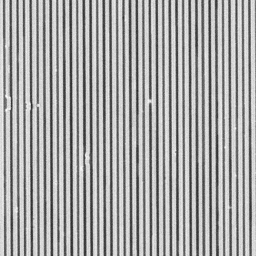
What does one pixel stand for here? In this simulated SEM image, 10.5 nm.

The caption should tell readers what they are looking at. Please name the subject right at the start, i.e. parallel lines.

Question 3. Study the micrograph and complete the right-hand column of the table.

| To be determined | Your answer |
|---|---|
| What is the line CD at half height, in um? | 0.038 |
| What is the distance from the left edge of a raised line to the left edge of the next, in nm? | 69.4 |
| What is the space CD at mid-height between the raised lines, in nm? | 38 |